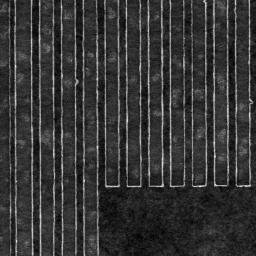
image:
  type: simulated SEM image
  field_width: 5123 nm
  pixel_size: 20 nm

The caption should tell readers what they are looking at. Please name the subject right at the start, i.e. parallel lines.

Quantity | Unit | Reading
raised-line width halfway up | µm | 0.175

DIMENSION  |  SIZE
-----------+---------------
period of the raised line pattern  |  441 nm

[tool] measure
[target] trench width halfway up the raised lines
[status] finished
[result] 273 nm